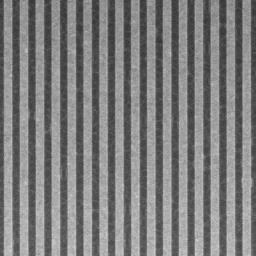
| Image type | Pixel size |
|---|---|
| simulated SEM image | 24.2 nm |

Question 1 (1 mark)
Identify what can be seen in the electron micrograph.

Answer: parallel lines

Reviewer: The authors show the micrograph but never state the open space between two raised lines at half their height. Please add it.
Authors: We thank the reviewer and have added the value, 193 nm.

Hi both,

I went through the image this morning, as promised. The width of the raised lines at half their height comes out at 193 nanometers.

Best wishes